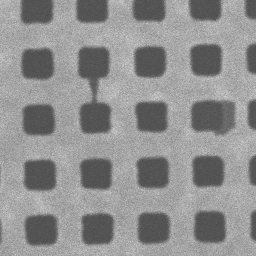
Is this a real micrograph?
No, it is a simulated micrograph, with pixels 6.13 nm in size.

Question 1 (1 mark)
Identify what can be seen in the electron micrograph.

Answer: a regular array of holes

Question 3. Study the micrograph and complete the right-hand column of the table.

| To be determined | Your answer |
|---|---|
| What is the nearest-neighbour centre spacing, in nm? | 337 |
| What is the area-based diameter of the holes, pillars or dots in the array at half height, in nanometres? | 213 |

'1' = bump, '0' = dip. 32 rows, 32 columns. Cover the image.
11100001100001111000011100001110
11100001110001111000011100001110
11100011110001111000111110011111
11111111111111111111111111111111
11111111111111111111111111111111
11111111111111111111111111111111
11100011110000111000011100001110
11100001110000111000011100001110
11100001110000111000011100001110
11100011110001111000111111111111
11111111111011111111111111111111
11111111111011111111111111111111
11111111111011111111111110011111
11100001110000111000011100000010
11100001110000111000011100000110
11100001110000111000011100000110
11100001110001111100111110000111
11111111111111111111111111111111
11111111111111111111111111111111
11111111111111111111111110011111
11100001110000111000011100001110
11100001110000111000011100001110
11100001110000111000011100001110
11100001111000111100111111111111
11111111111111111111111111111111
11111111111111111111111111111111
11111111111111111100111110001111
11100001110000111000011100001110
11100001110000111000011100001110
11100001110000111000011100001110
11110011111001111100111111111111
11111111111111111111111111111111